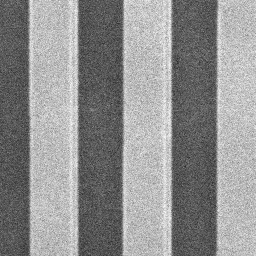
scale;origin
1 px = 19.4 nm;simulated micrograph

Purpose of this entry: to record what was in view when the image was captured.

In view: lines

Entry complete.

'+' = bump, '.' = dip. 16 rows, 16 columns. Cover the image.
..+++...+++...++
..+++...+++...++
..+++...+++...++
..+++...+++...++
..+++...+++...++
..+++...+++...++
..+++...+++...++
..+++...+++...++
..+++...+++...++
..+++...+++...++
..+++...+++...++
..+++...+++...++
..+++...+++...++
..+++...+++...++
..+++...+++...++
..+++...+++...++